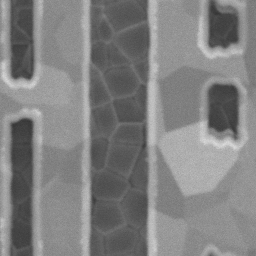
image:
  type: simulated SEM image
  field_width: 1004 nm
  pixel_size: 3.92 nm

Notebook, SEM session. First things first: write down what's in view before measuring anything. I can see one or a few lines or trenches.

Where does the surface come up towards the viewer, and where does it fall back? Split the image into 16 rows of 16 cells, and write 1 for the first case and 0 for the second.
0011100001111001
0011100001111001
0011100001111001
0011100001111111
0011100001111111
1111100001111001
1111100001111001
1011100001111001
0011100001111001
0011100001111111
0011100001111111
0011100001111111
0011100001111111
0011100001111111
0011100001111111
0011100001111111